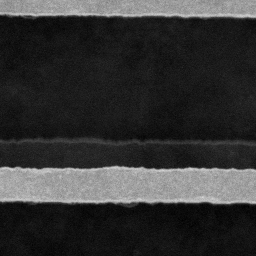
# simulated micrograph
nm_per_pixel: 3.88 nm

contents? lines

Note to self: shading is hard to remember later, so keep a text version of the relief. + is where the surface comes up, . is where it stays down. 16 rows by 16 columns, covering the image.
++++++++++++++++
................
................
................
................
................
................
................
................
................
+.....+++.......
++++++++++++++++
++++++++++++++++
................
................
................